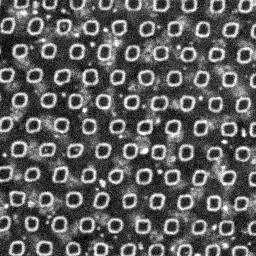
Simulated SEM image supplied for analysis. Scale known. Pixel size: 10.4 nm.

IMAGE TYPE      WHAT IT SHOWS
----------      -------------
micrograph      a regular array of raised bodies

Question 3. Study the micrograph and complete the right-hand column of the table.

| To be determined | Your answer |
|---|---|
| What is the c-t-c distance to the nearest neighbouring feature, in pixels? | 27.5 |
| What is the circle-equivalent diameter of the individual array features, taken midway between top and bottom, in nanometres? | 145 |